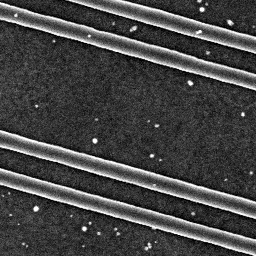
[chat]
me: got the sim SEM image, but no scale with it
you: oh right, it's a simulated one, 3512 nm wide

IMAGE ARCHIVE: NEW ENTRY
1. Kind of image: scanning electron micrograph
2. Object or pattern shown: lines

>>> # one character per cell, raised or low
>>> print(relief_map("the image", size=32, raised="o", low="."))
o.........ooooooo...............
oooo..........ooooooo...........
.ooooooo.........ooooooo........
....ooooooo..........ooooooo....
........ooooooo.........ooooooo.
...........ooooooo..........oooo
...............ooooooo.........o
..................ooooooo.......
......................ooooooo...
..........................oooooo
.............................ooo
................................
................................
................................
................................
................................
o...............................
oooo............................
.ooooooo........................
....ooooooo.....................
........ooooooo.................
o..........ooooooo..............
ooooo..........ooooooo..........
..ooooooo.........oooooooo......
.....ooooooo..........ooooooo...
.........ooooooo..........oooooo
............oooooooo.........ooo
................ooooooo.........
...................ooooooo......
.......................ooooooo..
...........................ooooo
..............................oo